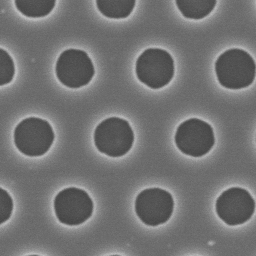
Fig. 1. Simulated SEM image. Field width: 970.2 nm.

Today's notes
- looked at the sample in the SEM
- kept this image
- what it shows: a regular array of holes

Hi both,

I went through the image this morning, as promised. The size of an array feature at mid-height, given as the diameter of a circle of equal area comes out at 151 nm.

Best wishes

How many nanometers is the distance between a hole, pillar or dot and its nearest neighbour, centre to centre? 302